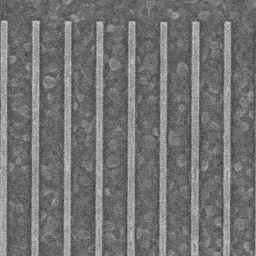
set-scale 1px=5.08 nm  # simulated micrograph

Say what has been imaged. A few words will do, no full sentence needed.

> parallel lines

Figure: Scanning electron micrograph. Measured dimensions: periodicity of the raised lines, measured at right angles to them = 162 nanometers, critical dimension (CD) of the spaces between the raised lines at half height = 129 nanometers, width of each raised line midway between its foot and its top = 6.12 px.